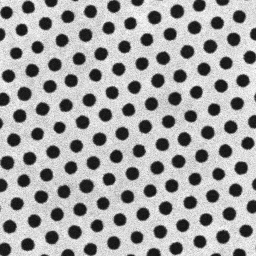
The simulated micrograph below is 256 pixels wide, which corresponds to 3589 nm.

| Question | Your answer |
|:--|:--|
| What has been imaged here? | a regular array of holes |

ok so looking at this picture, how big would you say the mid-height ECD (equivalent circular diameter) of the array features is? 190 nm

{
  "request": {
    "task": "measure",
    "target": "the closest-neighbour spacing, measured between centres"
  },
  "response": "323 nm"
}